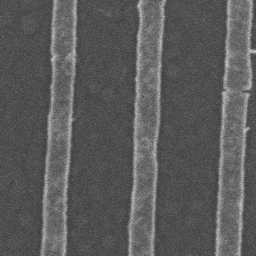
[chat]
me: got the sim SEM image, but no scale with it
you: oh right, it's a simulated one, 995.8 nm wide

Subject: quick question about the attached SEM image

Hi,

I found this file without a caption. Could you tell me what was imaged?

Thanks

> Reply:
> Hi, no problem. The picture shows one or a few lines or trenches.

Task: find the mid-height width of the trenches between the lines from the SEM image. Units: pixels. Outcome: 64.8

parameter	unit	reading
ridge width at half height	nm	86.4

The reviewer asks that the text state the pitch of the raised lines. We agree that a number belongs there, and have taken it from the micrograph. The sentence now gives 87.1 px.